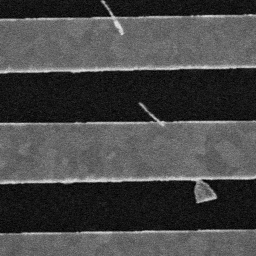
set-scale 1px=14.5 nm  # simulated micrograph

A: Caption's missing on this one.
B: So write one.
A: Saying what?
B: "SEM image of lines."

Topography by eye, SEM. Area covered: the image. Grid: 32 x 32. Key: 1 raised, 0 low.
00000000000000000000000000000000
00000000000000000000000000000000
11111111111111111111111111111111
11111111111111111111111111111111
11111111111111111111111111111111
11111111111111111111111111111111
11111111111111111111111111111111
11111111111111111111111111111111
11111111111111111111111111100000
00000000000000000000000000000000
00000000000000000000000000000000
00000000000000000000000000000000
00000000000000000000000000000000
00000000000000000000000000000000
00000000000000000000000000000000
11111111111111111111111111111111
11111111111111111111111111111111
11111111111111111111111111111111
11111111111111111111111111111111
11111111111111111111111111111111
11111111111111111111111111111111
11111111111111111111111111111111
11111111111111111100000000000000
00000000000000000000000000000000
00000000000000000000000001100000
00000000000000000000000000000000
00000000000000000000000000000000
00000000000000000000000000000000
00000000000000000000000000000000
11111111111111111111111111111111
11111111111111111111111111111111
11111111111111111111111111111111